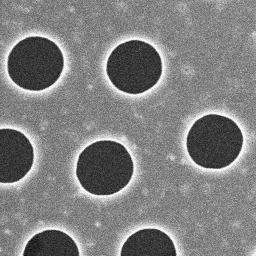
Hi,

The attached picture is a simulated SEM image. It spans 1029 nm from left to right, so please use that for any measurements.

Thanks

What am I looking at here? holes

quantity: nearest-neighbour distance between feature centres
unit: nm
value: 410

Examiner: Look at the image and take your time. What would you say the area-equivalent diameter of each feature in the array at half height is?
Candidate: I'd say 0.223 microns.